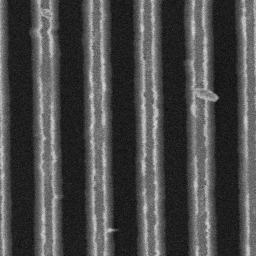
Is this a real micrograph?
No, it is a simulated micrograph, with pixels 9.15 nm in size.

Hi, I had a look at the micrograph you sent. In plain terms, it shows parallel lines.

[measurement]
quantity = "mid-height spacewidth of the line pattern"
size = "281 nm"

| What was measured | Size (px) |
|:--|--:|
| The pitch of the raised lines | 51.2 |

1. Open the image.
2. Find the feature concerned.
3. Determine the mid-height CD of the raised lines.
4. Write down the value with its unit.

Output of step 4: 185 nm